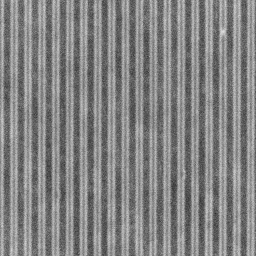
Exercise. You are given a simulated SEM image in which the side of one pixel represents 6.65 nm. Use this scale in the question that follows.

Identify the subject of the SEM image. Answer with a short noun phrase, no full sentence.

parallel lines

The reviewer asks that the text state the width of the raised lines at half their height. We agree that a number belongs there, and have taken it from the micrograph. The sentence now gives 32.4 nanometers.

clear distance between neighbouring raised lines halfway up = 8.75 px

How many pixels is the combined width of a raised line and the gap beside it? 13.9